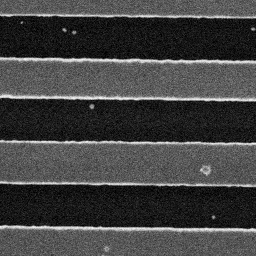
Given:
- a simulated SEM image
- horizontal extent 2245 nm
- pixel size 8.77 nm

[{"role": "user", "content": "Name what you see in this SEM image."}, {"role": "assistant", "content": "lines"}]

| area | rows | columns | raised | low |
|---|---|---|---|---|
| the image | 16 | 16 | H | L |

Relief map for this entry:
HHHHHHHHHHHHHHHH
LLLLLLLLLLLLLLLL
LLLLLLLLLLLLLLLL
LLLLLLLLLLLLLLLL
HHHHHHHHHHHHHHHH
HHHHHHHHHHHHHHHH
LLLLLLLLLLLLLLLL
LLLLLLLLLLLLLLLL
LLLLLLLLLLLLLLLL
HHHHHHHHHHHHHHHH
HHHHHHHHHHHHHHHH
LLLLLHHHHHHHHHHH
LLLLLLLLLLLLLLLL
LLLLLLLLLLLLLLLL
HHHHHHHHHHHHHHHH
HHHHHHHHHHHHHHHH